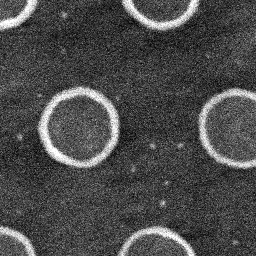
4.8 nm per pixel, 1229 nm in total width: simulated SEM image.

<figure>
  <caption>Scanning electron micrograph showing raised bodies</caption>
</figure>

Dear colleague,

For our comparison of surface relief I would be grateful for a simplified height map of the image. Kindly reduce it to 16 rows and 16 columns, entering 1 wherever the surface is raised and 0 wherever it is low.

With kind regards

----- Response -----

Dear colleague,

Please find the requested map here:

1100000011110000
1000000001100000
0000000000000000
0000000000000000
0000000000000000
0000000000000000
0001111000000111
0001111000000111
0001111000000111
0001111000000111
0000000000000000
0000000000000000
0000000000000000
0000000000000000
1000000001100000
1100000011110000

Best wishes